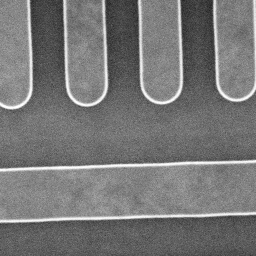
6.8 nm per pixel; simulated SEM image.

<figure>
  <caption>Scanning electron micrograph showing groups of lines, slits or small figures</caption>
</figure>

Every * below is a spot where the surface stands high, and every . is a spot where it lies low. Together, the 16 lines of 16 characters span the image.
**..**...**..***
**..***..**..***
**..***..**..***
**..***..**...**
**..***..**...**
**..***..**...**
*....*..........
................
................
................
...*************
****************
****************
*************...
................
................